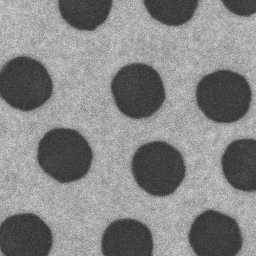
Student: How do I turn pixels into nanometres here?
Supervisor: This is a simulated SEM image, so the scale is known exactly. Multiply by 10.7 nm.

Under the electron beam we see holes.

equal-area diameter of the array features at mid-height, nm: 587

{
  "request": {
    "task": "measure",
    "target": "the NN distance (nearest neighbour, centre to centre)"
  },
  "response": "890 nanometers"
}